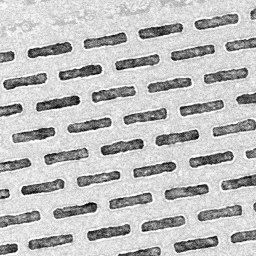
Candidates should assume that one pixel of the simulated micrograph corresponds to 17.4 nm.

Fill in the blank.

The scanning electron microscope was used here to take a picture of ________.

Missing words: a regular array of holes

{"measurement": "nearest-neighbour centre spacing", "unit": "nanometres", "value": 674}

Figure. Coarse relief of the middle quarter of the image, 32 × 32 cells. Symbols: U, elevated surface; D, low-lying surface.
UUUUUDDDDUUUUDDDDDDDDUDUUUUUUUUU
DDDDDDDDDDUUUDDUUUUUUUUUUUUUUUUU
DDDDDDDDDUUUUUUUUUUUUUUUUUUUUUUU
DDDDDUUUUUUUUUUUUUUUUUUUUUUUDDDD
UUUUUUUUUUUUUUUUUUUUUUDDDDDDDDDD
UUUUUUUUUUUUUUDDDDUUUDDDDDDDDDDD
UUUUUUUUUDDDDDDDDDUUUDDDDDDUUUUU
UUUUUUUDDDDDDDDDDDUUUUUUUUUUUUUU
DDDDUUUDDDDDDDDUUUUUUUUUUUUUUUUU
DDDDUUUDDUUUUUUUUUUUUUUUUUUUUUUU
DDDUUUUUUUUUUUUUUUUUUUUUUUUUUUDD
UUUUUUUUUUUUUUUUUUUUUDDDDDUUUDDD
UUUUUUUUUUUUUUUUUDDDDDDDDDUUUDDD
UUUUUUUUUDDDUUUDDDDDDDDDDDUUUUUU
UUUDDDDDDDDDUUUDDDDDDUUUUUUUUUUU
UDDDDDDDDDDDUUUUUUUUUUUUUUUUUUUU
UDDDDDDDUUUUUUUUUUUUUUUUUUUUUUUU
UUDUUUUUUUUUUUUUUUUUUUUUUDDDDDDD
UUUUUUUUUUUUUUUUUUUUUUUDDDDDDDDD
UUUUUUUUUUUUUDDDDDDDUUUDDDDDDDDU
UUUUUUUUUDDDDDDDDDDDUUUDDUUUUUUU
UUDDDDUUUDDDDDDDDDDUUUUUUUUUUUUU
DDDDDDUUUDDDDDUUUUUUUUUUUUUUUUUU
DDDDDDUUUUUUUUUUUUUUUUUUUUUUUUUU
DUUUUUUUUUUUUUUUUUUUUUUUUUDDUUUD
UUUUUUUUUUUUUUUUUUUUDDDDDDDDUUUD
UUUUUUUUUUUUUUUUUDDDDDDDDDDDUUUU
UUUUUUUUDDDDDDUUUDDDDDDDUUUUUUUU
UUUDDDDDDDDDDDUUUUDUUUUUUUUUUUUU
UUUDDDDDDDDDUUUUUUUUUUUUUUUUUUUU
UUUDDDDUUUUUUUUUUUUUUUUUUUUUUUUD
UUUUUUUUUUUUUUUUUUUUUUUUUUDDDDDD